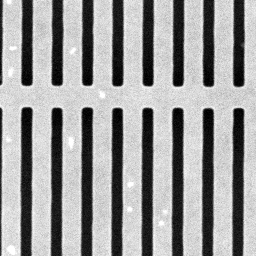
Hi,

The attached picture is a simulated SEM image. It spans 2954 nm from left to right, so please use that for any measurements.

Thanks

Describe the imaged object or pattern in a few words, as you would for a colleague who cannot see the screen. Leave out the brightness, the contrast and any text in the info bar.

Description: groups of lines, slits or small figures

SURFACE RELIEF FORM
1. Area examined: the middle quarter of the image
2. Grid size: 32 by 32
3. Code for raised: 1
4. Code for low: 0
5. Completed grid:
11110001111100011110000111100011
11110001111100011110000111100011
11110001111100011110000111100011
11110001111100011110000111100011
11110001111100011110000111100011
11111001111100111111001111100011
11111111111111111111111111111111
11111111111111111111111111111111
11111111111111111111111111111111
11111111111111111111111111111111
11111111111111111111111111111111
11110001111100011111001111100011
11110001111100011110000111100011
11110001111100011110000111100011
11110001111100011110000111100011
11110001111100011110000111100011
11110001111100011110000111100011
11110001111100011110000111100011
11110001111100011110000111100011
11110001111100011110001111100011
11110001111100011110001111100011
11110001111100011110001111100011
11110001111100011110000111100011
11110001111100011110000111100011
11110001111100011110001111100011
11110001111100011110001111100011
11110001111100011110001111100011
11110001111100011110001111100011
11110001111100011110001111100011
11110001111100011110001111100011
11110001111100011110001111100011
11110001111100011110001111100011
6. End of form